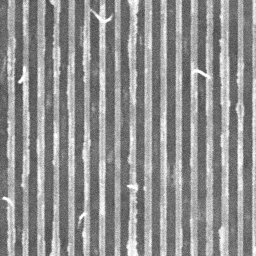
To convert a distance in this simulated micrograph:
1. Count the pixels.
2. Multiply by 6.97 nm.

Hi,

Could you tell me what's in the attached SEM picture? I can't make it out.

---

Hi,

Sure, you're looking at parallel lines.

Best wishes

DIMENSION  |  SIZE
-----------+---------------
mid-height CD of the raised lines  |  41 nanometers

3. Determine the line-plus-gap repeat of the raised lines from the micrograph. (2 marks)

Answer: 0.107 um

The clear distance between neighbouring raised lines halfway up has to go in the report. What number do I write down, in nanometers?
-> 68.9